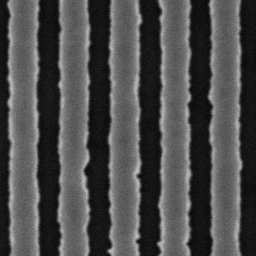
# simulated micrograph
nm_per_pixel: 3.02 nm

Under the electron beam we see parallel lines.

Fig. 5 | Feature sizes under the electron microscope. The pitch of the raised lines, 152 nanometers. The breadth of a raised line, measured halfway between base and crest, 84.5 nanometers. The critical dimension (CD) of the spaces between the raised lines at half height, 0.0691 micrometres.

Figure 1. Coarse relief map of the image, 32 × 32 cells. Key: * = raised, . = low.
.****...***...***...****..****..
.****..****...***...****..****..
.****..****...****..****..****..
.****...***...***...****...***..
.****...***...***...****..****..
.****...***...***...****...***..
.****...***...***...****..****..
.****..****...***...****..****..
.****..****...***...****..****..
.****...***...***...***...****..
.****..****...***...****..****..
.****...***...***...****..****..
.****...***...***...****..****..
.****...***...***...***....***..
.****..****...***...****..****..
.****...***...***...****..****..
.****...***...***...****..****..
.****..****...***...****..****..
.****..****...***...****..****..
.****...***...***...****..****..
.****...***...***...****..****..
.****...**....***...****..****..
.****...***...***...****..****..
.****...***...***...****..****..
.****...***...***...****..****..
.****...***...***...****..****..
.****..****...***...****..****..
.****..****...***...****..****..
.****...***...***...****..****..
.****...***...***...****..****..
.****...***...***...***....***..
.****...***...***...****..****..